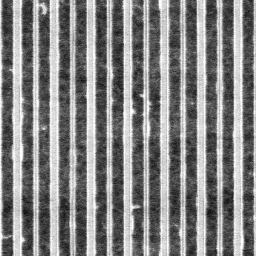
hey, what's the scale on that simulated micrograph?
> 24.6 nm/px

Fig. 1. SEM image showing parallel lines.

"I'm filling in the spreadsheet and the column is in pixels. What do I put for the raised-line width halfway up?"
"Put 14.2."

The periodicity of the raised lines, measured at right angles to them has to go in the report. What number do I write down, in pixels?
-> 18.4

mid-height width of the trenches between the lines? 129 nm